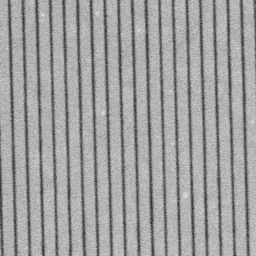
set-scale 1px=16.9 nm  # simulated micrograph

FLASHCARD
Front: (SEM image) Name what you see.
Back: parallel lines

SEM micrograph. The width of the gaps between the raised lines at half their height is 48.7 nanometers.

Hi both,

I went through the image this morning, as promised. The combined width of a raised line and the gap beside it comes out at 231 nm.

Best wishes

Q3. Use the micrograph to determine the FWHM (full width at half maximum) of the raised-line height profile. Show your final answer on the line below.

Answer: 184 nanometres